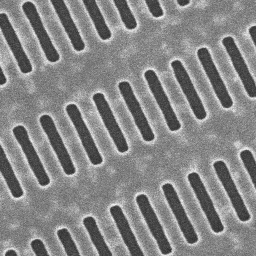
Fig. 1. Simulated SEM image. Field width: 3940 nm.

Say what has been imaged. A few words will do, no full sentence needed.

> a regular array of holes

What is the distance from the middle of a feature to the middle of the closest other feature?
435 nm